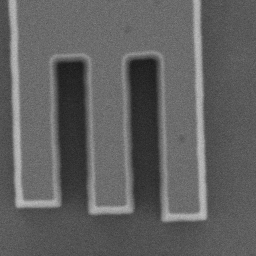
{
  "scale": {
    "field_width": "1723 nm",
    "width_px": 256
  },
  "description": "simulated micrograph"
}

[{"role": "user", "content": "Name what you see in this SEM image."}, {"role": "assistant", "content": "groups of lines, slits or small figures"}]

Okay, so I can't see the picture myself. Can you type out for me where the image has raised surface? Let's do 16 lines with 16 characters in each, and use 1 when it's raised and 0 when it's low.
0111111111110000
0111111111110000
0111111111110000
0111111111110000
0110011100110000
0110011100110000
0110001100110000
0110001100111000
0110001100111000
0111001100111000
0111001100111000
0111001100111000
0110001100111000
0000000000010000
0000000000000000
0000000000000000